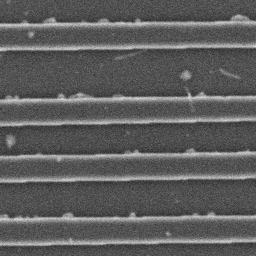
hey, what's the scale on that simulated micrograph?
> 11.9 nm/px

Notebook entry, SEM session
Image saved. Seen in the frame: lines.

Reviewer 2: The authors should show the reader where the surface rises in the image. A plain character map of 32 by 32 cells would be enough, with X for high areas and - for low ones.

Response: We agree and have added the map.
--------------------------------
--------------------------------
-----------------------------X--
XXXXXXXXXXXXXXXXXXXXXXXXXXXXXXXX
XXXXXXXXXXXXXXXXXXXXXXXXXXXXXXXX
XXXXXXXXXXXXXXXXXXXXXXXXXXXXXXXX
--------------------------------
--------------------------------
--------------------------------
--------------------------------
--------------------------------
--------------------------------
--XXXXXXXXXXXXXXXXXXXXXXXXXXXXXX
XXXXXXXXXXXXXXXXXXXXXXXXXXXXXXXX
XXXXXXXXXXXXXXXXXXXXXXXXXXXXXXXX
XXXXXXXX------------------------
--------------------------------
--------------------------------
--------------------------------
--XXXXXXXXXXXXXXXXXXXXXXXXXXXXXX
XXXXXXXXXXXXXXXXXXXXXXXXXXXXXXXX
XXXXXXXXXXXXXXXXXXXXXXXXXXXXXXXX
XXXXXXXXXXXXXXXX----------------
--------------------------------
--------------------------------
--------------------------------
--------------------------------
XXXXXXXXXXXXXXXXXXXXXXXXXXXXXXXX
XXXXXXXXXXXXXXXXXXXXXXXXXXXXXXXX
XXXXXXXXXXXXXXXXXXXXXXXXXXXXXXXX
XXXXXXXXXXXXX-------------------
--------------------------------